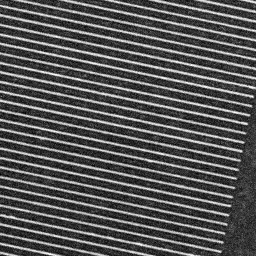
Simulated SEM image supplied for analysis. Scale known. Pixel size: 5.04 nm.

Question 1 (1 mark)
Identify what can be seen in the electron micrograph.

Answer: parallel lines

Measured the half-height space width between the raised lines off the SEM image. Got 39.5 nm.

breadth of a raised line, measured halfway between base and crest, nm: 8.6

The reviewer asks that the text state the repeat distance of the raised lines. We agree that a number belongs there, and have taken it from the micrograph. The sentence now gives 0.0469 microns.